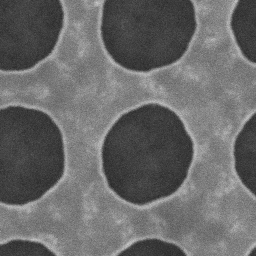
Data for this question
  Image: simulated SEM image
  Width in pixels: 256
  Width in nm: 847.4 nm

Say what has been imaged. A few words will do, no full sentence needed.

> holes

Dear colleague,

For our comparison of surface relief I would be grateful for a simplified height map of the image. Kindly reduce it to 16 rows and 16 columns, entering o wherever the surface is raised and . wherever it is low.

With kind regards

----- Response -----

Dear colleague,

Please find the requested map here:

....oo......ooo.
....oo......oo..
....oo......ooo.
...oooo....oooo.
oooooooooooooooo
oooooooooooooooo
ooooooooo.oooooo
...oooo....ooooo
....ooo.....ooo.
....oo......ooo.
....oo......ooo.
...oooo....oooo.
..oooooo..oooooo
oooooooooooooooo
oooooooooooooooo
...ooooo...ooooo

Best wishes